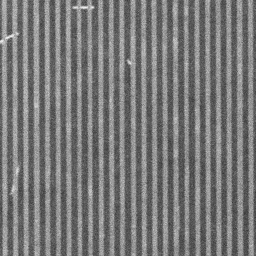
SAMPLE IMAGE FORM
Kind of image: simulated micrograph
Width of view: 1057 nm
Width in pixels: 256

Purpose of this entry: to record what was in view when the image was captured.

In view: parallel lines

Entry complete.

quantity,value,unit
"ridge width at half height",0.0134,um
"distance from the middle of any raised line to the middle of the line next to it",44.2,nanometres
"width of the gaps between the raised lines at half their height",29.9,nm